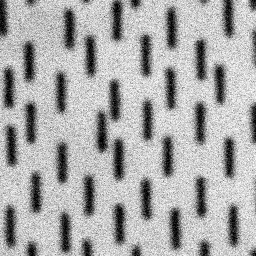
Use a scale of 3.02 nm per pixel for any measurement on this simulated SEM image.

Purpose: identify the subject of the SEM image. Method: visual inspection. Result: a regular array of holes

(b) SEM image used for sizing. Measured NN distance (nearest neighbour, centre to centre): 37 px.